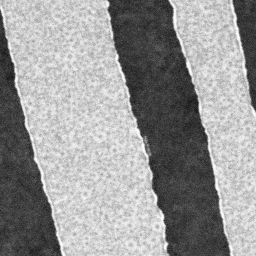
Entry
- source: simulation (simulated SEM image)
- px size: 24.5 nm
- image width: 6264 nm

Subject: one or a few lines or trenches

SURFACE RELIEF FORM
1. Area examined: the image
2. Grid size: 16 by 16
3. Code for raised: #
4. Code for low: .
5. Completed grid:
#######....####.
#######....####.
#######....####.
.######.....###.
.#######....###.
.#######....####
.#######....####
..######.....###
..#######....###
..#######....###
..#######....###
...######.....##
...#######....##
...#######....##
....######....##
....######....##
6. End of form